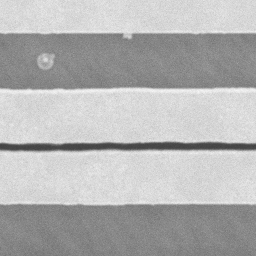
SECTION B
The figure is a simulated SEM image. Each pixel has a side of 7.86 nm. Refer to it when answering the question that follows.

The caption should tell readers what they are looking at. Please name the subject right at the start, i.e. lines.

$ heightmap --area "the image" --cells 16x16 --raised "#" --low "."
################
################
................
................
................
................
################
################
################
################
################
################
################
................
................
................